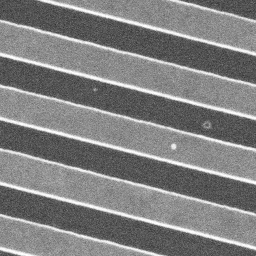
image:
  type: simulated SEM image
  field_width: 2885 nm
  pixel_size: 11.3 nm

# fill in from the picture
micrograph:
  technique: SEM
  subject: lines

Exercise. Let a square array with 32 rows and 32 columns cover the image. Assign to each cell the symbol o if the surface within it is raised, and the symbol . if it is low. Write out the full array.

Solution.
.......ooooooooooooooooo........
...........ooooooooooooooooo....
...............oooooooooooooooo.
oooo...............ooooooooooooo
oooooooo...............ooooooooo
oooooooooooo..............oooooo
oooooooooooooooo..............oo
..oooooooooooooooooo............
......oooooooooooooooooo........
..........oooooooooooooooooo....
..............oooooooooooooooooo
ooo...............oooooooooooooo
ooooooo...............oooooooooo
oooooooooooo..............oooooo
ooooooooooooooo...............oo
..ooooooooooooooooo.............
......ooooooooooooooooo.........
..........ooooooooooooooooo.....
..............ooooooooooooooooo.
oooo..............oooooooooooooo
oooooooo..............oooooooooo
ooooooooooo...............oooooo
ooooooooooooooo...............oo
..ooooooooooooooooo.............
......ooooooooooooooooo.........
..........ooooooooooooooooo.....
..............ooooooooooooooooo.
ooo...............oooooooooooooo
ooooooo..............ooooooooooo
oooooooooo...............ooooooo
ooooooooooooooo..............ooo
.oooooooooooooooooo.............